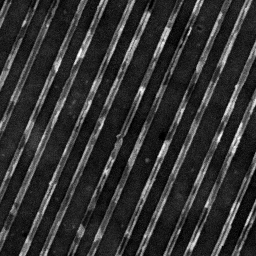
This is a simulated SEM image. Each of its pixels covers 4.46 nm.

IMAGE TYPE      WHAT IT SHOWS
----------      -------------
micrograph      parallel lines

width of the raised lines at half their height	26.1	nanometres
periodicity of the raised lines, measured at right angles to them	98	nm